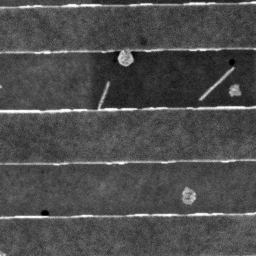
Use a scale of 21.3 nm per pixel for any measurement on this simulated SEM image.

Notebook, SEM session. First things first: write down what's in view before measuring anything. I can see lines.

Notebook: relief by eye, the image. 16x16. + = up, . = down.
++++++++++++++++
++++++++++++++++
++++++++++++++++
.......+........
................
................
................
++++++++++++++++
++++++++++++++++
++++++++++++++++
................
................
................
.......+++++++++
++++++++++++++++
++++++++++++++++